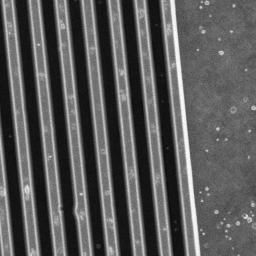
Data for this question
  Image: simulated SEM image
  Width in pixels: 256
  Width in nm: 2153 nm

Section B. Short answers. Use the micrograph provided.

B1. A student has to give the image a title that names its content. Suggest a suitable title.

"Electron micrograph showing parallel lines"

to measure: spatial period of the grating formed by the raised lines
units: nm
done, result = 221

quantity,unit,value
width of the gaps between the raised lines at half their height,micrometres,0.117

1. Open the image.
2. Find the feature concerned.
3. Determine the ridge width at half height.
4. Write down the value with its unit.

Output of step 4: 110 nm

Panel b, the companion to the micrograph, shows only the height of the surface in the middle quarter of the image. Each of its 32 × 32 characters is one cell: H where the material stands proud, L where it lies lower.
HHLLLLHHHLLLLHHHLLLHHHLLLLHHHLLL
HHLLLLHHHLLLLHHHLLLHHHLLLLHHHLLL
HHHLLLHHHLLLLHHHLLLHHHLLLLHHHLLL
HHHLLLHHHLLLLHHHLLLLHHLLLLHHHLLL
HHHLLLHHHLLLLHHHLLLLHHHLLLHHHLLL
HHHLLLLHHLLLLHHHLLLLHHHLLLHHHLLL
HHHLLLLHHHLLLHHHLLLLHHHLLLHHHLLL
HHHLLLLHHHLLLHHHLLLLHHHLLLLHHLLL
HHHLLLLHHHLLLHHHLLLLHHHLLLLHHHLL
HHHLLLLHHHLLLLHHLLLLHHHLLLLHHHLL
HHHLLLLHHHLLLLHHHLLLHHHLLLLHHHLL
HHHLLLLHHHLLLLHHHLLLHHHLLLLHHHLL
HHHHLLLHHHLLLLHHHLLLHHHHLLLHHHLL
LHHHLLLHHHLLLLHHHLLLLHHLLLLHHHLL
LHHHLLLHHHLLLLHHHLLLLHHHLLLHHHLL
LHHHLLLHHHLLLLHHHLLLLHHHLLLHHHLL
LHHHLLLHHHHLLLHHHLLLLHHHLLLHHHLL
LHHHLLLLHHHLLLHHHLLLLHHHLLLLHHLL
LHHHLLLLHHHLLLHHHLLLLHHHLLLLHHHL
LHHHLLLLHHHLLLLHHLLLLHHHLLLLHHHL
LHHHLLLLHHHLLLLHHHLLLHHHLLLLHHHL
LHHHLLLLHHHLLLLHHHLLLHHHLLLLHHHL
LHHHHLLLHHHLLLLHHHLLLHHHLLLLHHHL
LLHHHLLLHHHLLLLHHHLLLLHHLLLLHHHL
LLHHHLLLHHHLLLLHHHLLLLHHHLLLHHHL
LLHHHLLLHHHLLLLHHHLLLLHHHLLLHHHL
LLHHHLLLHHHHLLLHHHLLLLHHHLLLHHHL
LLHHHLLLLHHHLLLHHHLLLLHHHLLLLHHL
LLHHHLLLLHHHLLLHHHLLLLHHHLLLLHHH
LLHHHLLLLHHHLLLLHHLLLLHHHLLLLHHH
LLHHHLLLLHHHLLLLHHHLLLHHHLLLLHHH
LLHHHLLLLHHHLLLLHHHLLLHHHLLLLHHH